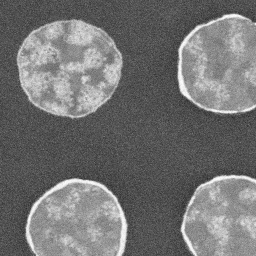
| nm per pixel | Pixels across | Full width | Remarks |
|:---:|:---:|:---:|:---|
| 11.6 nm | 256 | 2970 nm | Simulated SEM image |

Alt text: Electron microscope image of raised bodies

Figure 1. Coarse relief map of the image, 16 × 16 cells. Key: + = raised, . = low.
................
.............+++
............++++
...........+++++
...........+++++
...........+++++
............++++
................
................
................
................
....++.......+++
..+++++.....++++
..++++++....++++
..++++++...+++++
..++++++....++++